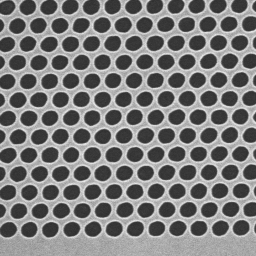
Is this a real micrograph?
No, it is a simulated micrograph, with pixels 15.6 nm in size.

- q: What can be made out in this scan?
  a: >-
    a regular array of holes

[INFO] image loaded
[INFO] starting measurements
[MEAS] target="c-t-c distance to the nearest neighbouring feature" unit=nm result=327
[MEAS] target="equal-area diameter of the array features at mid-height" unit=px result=16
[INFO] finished